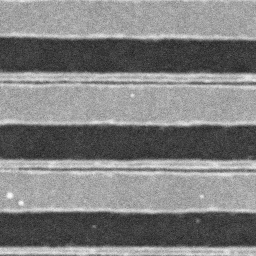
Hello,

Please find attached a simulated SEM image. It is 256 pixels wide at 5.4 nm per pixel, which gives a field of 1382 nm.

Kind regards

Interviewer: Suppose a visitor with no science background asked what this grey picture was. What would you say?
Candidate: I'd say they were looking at lines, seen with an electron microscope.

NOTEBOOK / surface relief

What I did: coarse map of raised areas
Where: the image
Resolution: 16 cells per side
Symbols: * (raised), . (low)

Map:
****************
****************
................
................
................
****************
****************
****************
................
................
****************
****************
****************
................
................
................